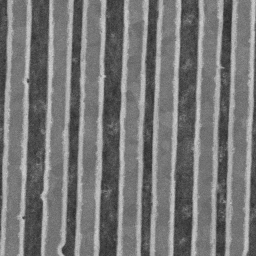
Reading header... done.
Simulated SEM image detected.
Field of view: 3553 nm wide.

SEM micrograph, parallel lines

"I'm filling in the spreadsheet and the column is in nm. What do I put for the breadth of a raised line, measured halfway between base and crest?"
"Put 260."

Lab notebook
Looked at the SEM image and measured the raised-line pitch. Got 519 nm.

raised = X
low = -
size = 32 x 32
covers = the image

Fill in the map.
-XXX--XXX--XX---XX--XX---XXX-XXX
-XXX--XXX--XX---XX--XX---XXX-XXX
-XXX--XXX--XX---XX--XX---XXX-XXX
-XX---XXX--XX---XX--XX---XXX-XXX
-XX---XXX--XX---XX--XX---XX--XXX
-XXX--XXX--XX---XX--XX---XX--XXX
-XX---XXX-XXX---XX--XX---XX--XX-
-XX---XXX-XXX---XX--XX---XX--XX-
-XX---XXX-XXX---XX--XX---XX--XX-
-XX---XXX-XXX---XX--XX---XX--XX-
-XX---XX--XXX--XXX--XX---XX--XX-
-XX---XX--XXX--XXX--XX---XX--XX-
-XX---XX--XXX--XXX--XX---XX--XX-
-XX---XX--XXX--XXX--XX---XX--XX-
-XX---XX--XXX--XXX--XX---XX--XX-
-XX---XX--XX---XXX--XX---XX--XX-
-XX---XX--XX---XXX-XXX---XX--XX-
-XX---XX--XX---XXX-XXX---XX--XX-
-XX---XX--XX---XXX-XXX---XX--XX-
-XX---XX--XX---XXX-XXX---XX--XX-
-XX---XX--XX---XX--XXX---XX--XX-
-XX---XX--XX---XX--XXX--XXX--XX-
-XX---XX--XX---XX--XXX---XX--XX-
-XX---XX--XX---XX--XXX---XX--XX-
-XX--XXX--XX---XX--XXX--XXX--XX-
-XX---XX--XX---XX--XXX--XXX--XX-
-XX---XX--XX---XX--XXX--XXX--XX-
XXX---XX--XX---XX--XX---XXX--XX-
XXX---XX--XX---XX--XX---XXX--XX-
XXX--XXX--XX---XX--XX---XXX--XX-
XXX--XXX--XX---XX--XX---XXX--XX-
XXX--XXX--XX---XX--XX---XXX--XX-